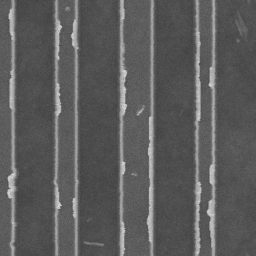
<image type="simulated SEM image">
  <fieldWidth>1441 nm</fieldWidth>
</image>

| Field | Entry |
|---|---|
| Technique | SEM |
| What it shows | one or a few lines or trenches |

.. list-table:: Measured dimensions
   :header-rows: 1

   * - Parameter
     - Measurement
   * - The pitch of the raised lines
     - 391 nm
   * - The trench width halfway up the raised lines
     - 44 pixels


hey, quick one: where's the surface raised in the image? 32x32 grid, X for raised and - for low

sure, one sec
XX-----XXX-----XXXX------XX-----
XX-----XXX-----XXXX------XX-----
XX-----XXX-----XXXX------XX-----
XX-----XXX-----XXXX------XX-----
XX-----XXX-----XXXX------XX-----
XX-----XXX-----XXXX------XX-----
XX-----XXX-----XXXX------XX-----
XX-----XXX-----XXXX------XX-----
XX-----XXX-----XXXX------XX-----
XX-----XXX-----XXXX------XX-----
XX-----XXX-----XXXX------XX-----
XX-----XXX-----XXXX------XX-----
XX-----XXX-----XXXX------XX-----
XX-----XXX-----XXXX------XX-----
XX-----XXX-----XXXX------XX-----
XX-----XXX-----XXXX------XX-----
XX-----XXX-----XXXX------XX-----
XX-----XXX-----XXXX------XX-----
XX-----XXX-----XXXX------XX-----
XX-----XXX-----XXXX------XX-----
XX-----XXX-----XXXX------XX-----
XX-----XXX-----XXXX------XX-----
XX-----XXX-----XXXX------XX-----
XX-----XXX-----XXXX------XX-----
XX-----XXX-----XXXX------XX-----
XX-----XXX-----XXXX------XX-----
XX-----XX------XXXX------XX-----
XX-----XX------XXXX------XX-----
XX-----XX------XXXX------XX-----
XX-----XX------XXXX------XX-----
X------XX------XXXX------XX-----
XX-----XX------XXXX------XX-----